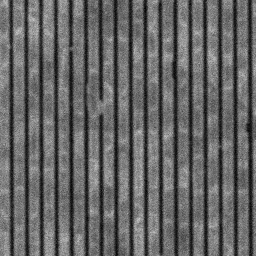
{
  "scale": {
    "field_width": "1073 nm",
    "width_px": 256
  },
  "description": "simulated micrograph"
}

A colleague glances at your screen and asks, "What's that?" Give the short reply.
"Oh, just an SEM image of parallel lines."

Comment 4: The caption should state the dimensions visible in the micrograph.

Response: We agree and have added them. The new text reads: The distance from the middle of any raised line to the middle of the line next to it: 62.5 nm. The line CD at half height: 0.0424 um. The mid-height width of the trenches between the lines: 20.9 nm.